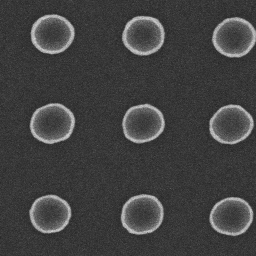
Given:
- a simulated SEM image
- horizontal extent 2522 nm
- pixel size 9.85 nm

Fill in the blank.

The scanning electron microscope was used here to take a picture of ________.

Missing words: a regular array of raised bodies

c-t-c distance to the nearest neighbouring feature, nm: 879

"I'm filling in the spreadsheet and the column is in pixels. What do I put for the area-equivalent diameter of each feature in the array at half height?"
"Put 38.5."